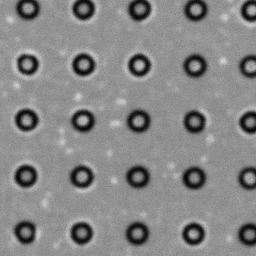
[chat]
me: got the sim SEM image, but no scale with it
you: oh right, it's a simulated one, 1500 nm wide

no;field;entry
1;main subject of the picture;a regular array of ring-shaped grooves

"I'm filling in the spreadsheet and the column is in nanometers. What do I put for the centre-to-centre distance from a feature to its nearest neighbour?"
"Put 327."